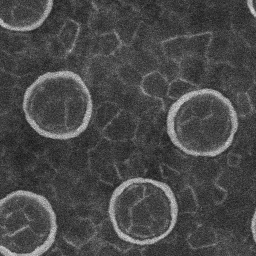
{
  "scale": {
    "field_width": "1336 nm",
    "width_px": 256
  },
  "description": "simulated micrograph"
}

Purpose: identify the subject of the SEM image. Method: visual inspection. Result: raised bodies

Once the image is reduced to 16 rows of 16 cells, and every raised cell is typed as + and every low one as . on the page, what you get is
+++.............
++..............
................
................
................
..+++...........
..++++.....+++..
..++++.....++++.
...+.......++++.
............++..
................
........++......
+++....++++.....
+++....++++.....
+++....++++.....
+++.............